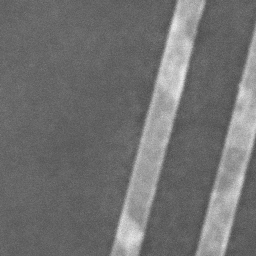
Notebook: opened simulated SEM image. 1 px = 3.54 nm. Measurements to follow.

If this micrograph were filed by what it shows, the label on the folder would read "one or a few lines or trenches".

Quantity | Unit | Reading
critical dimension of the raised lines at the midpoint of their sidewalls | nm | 86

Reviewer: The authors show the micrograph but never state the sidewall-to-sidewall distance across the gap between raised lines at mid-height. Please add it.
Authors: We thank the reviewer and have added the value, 0.203 microns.